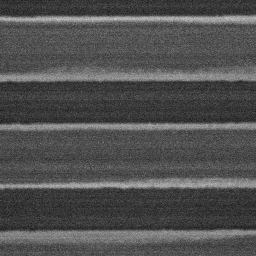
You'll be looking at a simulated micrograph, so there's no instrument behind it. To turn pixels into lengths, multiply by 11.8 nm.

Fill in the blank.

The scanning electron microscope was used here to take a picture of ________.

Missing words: lines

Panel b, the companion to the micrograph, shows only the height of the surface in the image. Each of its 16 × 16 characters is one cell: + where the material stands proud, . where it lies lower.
................
++++++++++++++++
++++++++++++++++
++++++++++++++++
++++++++++++++++
................
................
................
++++++++++++++++
++++++++++++++++
++++++++++++++++
++++++++++++++++
................
................
..............++
++++++++++++++++